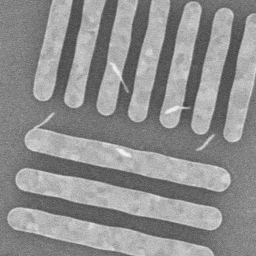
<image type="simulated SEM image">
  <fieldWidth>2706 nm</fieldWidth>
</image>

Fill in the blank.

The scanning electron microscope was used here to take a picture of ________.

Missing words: groups of lines, slits or small figures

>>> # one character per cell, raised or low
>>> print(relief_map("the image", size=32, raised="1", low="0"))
00000001100110011001100010000000
00000011101110011001100110011000
00000011101100111001100110011001
00000011001100110011101110011001
00000011001100110011101110111011
00000111001100110011001100111011
00000111011100110011001100110011
00000110011001110111001100110011
00000110011001100111011101110011
00000110011001100110011001110111
00001110111001100110011001100111
00001110111011100110011001100110
00000100110011101110011001100110
00000000000011001100111011100110
00000000000000001100110011001110
00000000000000000000110011001100
00001110000000000000000011001100
00011111111000000000000000001100
00001111111111110000000000000000
00000001111111111111100000000000
00000000000111111111111110000000
00111100000000001111111111110000
00111111111000000000011111111000
00011111111111100000000000110000
00000001111111111111000000000000
00000000000111111111111100000000
01111000000000001111111111100000
01111111110000000000111111110000
00111111111111100000000001100000
00000011111111111110000000000000
00000000001111111111111100000000
00000000000000011111111111000000